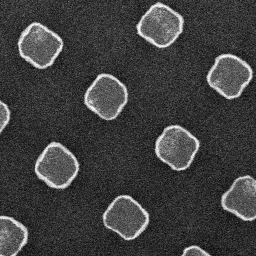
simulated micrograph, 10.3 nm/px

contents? raised bodies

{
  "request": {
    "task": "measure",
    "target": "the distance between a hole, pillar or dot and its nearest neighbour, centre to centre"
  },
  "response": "884 nm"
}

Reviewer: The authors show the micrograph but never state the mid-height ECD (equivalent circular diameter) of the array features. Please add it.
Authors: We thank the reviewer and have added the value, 423 nm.